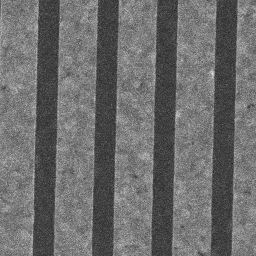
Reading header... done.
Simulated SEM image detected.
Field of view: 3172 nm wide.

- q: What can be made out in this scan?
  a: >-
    parallel lines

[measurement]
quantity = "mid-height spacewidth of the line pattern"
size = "272 nm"